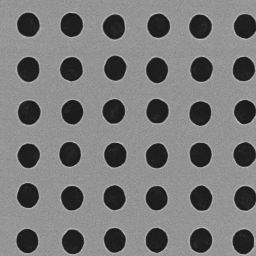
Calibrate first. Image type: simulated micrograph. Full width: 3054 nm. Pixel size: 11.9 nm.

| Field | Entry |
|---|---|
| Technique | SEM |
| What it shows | a regular array of holes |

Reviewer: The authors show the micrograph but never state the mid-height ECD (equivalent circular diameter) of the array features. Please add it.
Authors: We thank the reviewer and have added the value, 278 nm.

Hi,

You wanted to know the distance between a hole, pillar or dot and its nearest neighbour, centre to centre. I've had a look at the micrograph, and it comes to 501 nm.